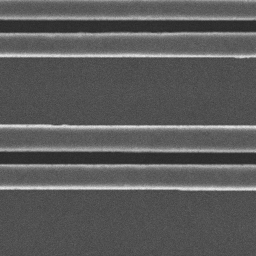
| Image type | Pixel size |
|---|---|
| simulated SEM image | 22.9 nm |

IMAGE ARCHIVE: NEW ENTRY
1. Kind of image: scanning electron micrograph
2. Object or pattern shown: lines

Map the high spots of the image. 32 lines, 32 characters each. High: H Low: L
HHHHHHHHHHHHHHHHHHHHHHHHHHHHHHHH
HHHHHHHHHHHHHHHHHHHHHHHHHHHHHHHH
LLLLLLLLLLLLLLLLLLLLLLLLLLLLLLLL
LLLLLLLLLLLLLLLLLLLLLLLLLLLLLLLL
HHHHHHHHHHHHHHHHHHHHHHHHHHHHHHHH
HHHHHHHHHHHHHHHHHHHHHHHHHHHHHHHH
HHHHHHHHHHHHHHHHHHHHHHHHHHHHHHHH
LLLLLLLLLLLLLLLLLLLLLLLLLLLLLLLL
LLLLLLLLLLLLLLLLLLLLLLLLLLLLLLLL
LLLLLLLLLLLLLLLLLLLLLLLLLLLLLLLL
LLLLLLLLLLLLLLLLLLLLLLLLLLLLLLLL
LLLLLLLLLLLLLLLLLLLLLLLLLLLLLLLL
LLLLLLLLLLLLLLLLLLLLLLLLLLLLLLLL
LLLLLLLLLLLLLLLLLLLLLLLLLLLLLLLL
LLLLLLLLLLLLLLLLLLLLLLLLLLLLLLLL
LLLLLLLLLLLLLLLLLLLLLLLLLLLLLLLL
HHHHHHHHHHHHHHHHHHHHHHHHHHHHHHHH
HHHHHHHHHHHHHHHHHHHHHHHHHHHHHHHH
HHHHHHHHHHHHHHHHHHHHHHHHHHHHHHHH
LLLLLLLLLLLLLLLLLLLLLLLLLLLLLLLL
LLLLLLLLLLLLLLLLLLLLLLLLLLLLLLLL
HHHHHHHHHHHHHHHHHHHHHHHHHHHHHHHH
HHHHHHHHHHHHHHHHHHHHHHHHHHHHHHHH
HHHHHHHHHHHHHHHHHHHHHHHHHHHHHHHH
LLLLLLLLLLLLLLLLLLLLLLLLLLLLLLLL
LLLLLLLLLLLLLLLLLLLLLLLLLLLLLLLL
LLLLLLLLLLLLLLLLLLLLLLLLLLLLLLLL
LLLLLLLLLLLLLLLLLLLLLLLLLLLLLLLL
LLLLLLLLLLLLLLLLLLLLLLLLLLLLLLLL
LLLLLLLLLLLLLLLLLLLLLLLLLLLLLLLL
LLLLLLLLLLLLLLLLLLLLLLLLLLLLLLLL
LLLLLLLLLLLLLLLLLLLLLLLLLLLLLLLL